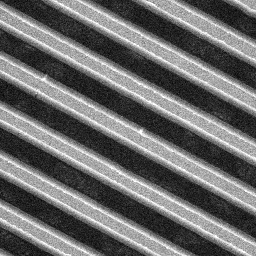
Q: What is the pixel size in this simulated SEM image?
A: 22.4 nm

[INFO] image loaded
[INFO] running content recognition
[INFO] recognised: parallel lines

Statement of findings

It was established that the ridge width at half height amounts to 402 nm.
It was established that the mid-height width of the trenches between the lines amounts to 580 nanometres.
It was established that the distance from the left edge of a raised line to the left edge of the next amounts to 978 nm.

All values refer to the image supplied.